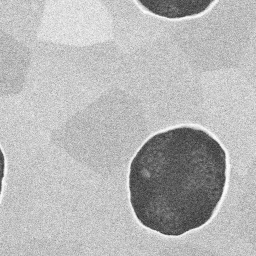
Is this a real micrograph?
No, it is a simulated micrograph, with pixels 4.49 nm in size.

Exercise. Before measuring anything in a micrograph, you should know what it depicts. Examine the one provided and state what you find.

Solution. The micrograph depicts holes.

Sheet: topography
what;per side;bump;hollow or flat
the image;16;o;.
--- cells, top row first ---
ooooooooo....ooo
oooooooooooooooo
oooooooooooooooo
oooooooooooooooo
oooooooooooooooo
oooooooooooooooo
oooooooooooooooo
oooooooooooooooo
oooooooooo...ooo
ooooooooo.....oo
oooooooo......oo
oooooooo......oo
oooooooo......oo
ooooooooo....ooo
oooooooooo..oooo
oooooooooooooooo